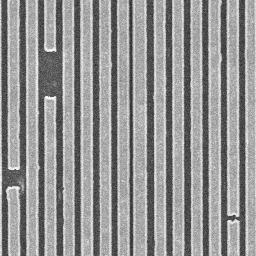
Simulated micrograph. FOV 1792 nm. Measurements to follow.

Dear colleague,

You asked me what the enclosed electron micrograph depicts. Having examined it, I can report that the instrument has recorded parallel lines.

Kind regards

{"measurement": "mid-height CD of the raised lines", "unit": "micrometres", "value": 0.0713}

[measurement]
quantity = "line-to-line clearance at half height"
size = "0.0542 µm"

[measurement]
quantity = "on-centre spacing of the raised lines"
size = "128 nm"